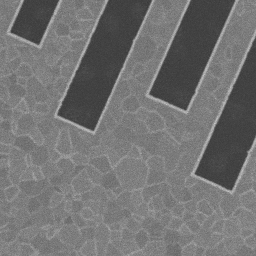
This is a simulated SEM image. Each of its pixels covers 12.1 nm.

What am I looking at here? one or a few lines or trenches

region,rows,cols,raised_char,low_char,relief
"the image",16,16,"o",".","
o...oo...ooo...o
o..ooo...oo...oo
o..ooo..ooo...oo
ooooo...oo...oo.
ooooo...oo...oo.
oooo...oo...oo..
oooo...ooo..oo..
oooo..oooooooo..
ooooooooooooo...
ooooooooooooo...
oooooooooooo...o
ooooooooooooo..o
oooooooooooooooo
oooooooooooooooo
oooooooooooooooo
oooooooooooooooo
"